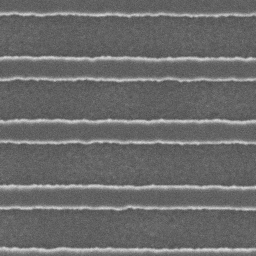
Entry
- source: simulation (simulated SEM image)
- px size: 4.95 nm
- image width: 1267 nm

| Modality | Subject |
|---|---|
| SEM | lines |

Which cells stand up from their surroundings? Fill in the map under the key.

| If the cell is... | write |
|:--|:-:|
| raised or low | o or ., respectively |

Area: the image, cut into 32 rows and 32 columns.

oooooooooooooooooooooooooooooooo
oooooooooooooooooooooooooooooooo
................................
................................
................................
................................
................................
oooooooooooooooooooooooooooooooo
oooooooooooooooooooooooooooooooo
oooooooooooooooooooooooooooooooo
................................
................................
................................
................................
................................
oooooooooooooooooooooooooooooooo
oooooooooooooooooooooooooooooooo
oooooooooooooooooooooooooooooooo
................................
................................
................................
................................
................................
oooooooooooooooooooooooooooooooo
oooooooooooooooooooooooooooooooo
oooooooooooooooooooooooooooooooo
................................
................................
................................
................................
................................
oooooooooooooooooooooooooooooooo